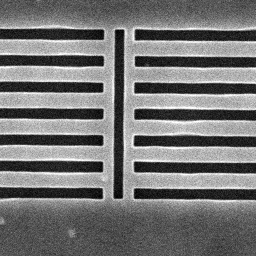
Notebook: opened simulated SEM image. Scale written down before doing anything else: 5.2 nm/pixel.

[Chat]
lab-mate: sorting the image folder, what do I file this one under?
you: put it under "groups of lines, slits or small figures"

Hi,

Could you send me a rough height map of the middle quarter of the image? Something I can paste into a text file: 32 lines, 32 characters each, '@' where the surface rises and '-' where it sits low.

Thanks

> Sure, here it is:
----------@@---@@@--------------
@@@@@@@@@@@@---@@@@@@@@@@@@@@@@@
@@@@@@@@@@@@---@@@@@@@@@@@@@@@@@
@@@@@@@@@@@@---@@@@@@@@@@@@@@@@@
------@@@@@@---@@@@@@@@@@@@@@@@@
----------@@---@@---------------
----------@@---@@---------------
@@@@@@@@@@@@---@@@----@@@@@@----
@@@@@@@@@@@@---@@@@@@@@@@@@@@@@@
@@@@@@@@@@@@---@@@@@@@@@@@@@@@@@
@@@@@@@@@@@@---@@@@@@@@@@@@@@@@@
----------@@---@@@--------------
----------@@---@@---------------
----------@@---@@---------------
@@@@@@@@@@@@---@@@@@@@@@@@@@----
@@@@@@@@@@@@---@@@@@@@@@@@@@@@@@
@@@@@@@@@@@@---@@@@@@@@@@@@@@@@@
---@@@@@@@@@---@@@@@@@@@@@@@@---
----------@@---@@---------------
----------@@---@@---------------
----------@@---@@@--------------
@@@@@@@@@@@@---@@@@@@@@@@@@@@@@@
@@@@@@@@@@@@---@@@@@@@@@@@@@@@@@
@@@@@@@@@@@@---@@@@@@@@@@@@@@@@@
----------@@---@@@--------------
----------@@---@@---------------
----------@@---@@---------------
@@@@@@@@@@@@---@@@@@@@@@@@@@@@--
@@@@@@@@@@@@---@@@@@@@@@@@@@@@@@
@@@@@@@@@@@@---@@@@@@@@@@@@@@@@@
@@@@@@@@@@@@---@@@@@@@@@@@@@@@@@
----------@@---@@---------------